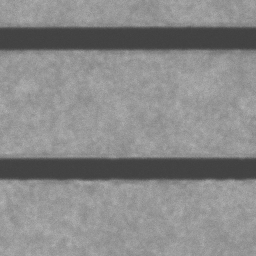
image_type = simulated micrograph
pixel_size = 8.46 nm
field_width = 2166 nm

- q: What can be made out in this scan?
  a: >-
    one or a few lines or trenches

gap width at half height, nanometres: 885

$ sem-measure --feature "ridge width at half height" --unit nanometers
221